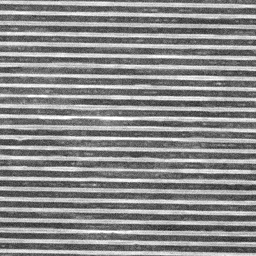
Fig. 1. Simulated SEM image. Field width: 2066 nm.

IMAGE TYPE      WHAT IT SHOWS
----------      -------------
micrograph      parallel lines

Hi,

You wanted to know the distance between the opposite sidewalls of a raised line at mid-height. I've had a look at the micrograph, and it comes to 0.0242 microns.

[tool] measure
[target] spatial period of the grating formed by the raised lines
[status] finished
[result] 10.4 px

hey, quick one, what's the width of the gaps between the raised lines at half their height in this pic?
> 56.5 nm